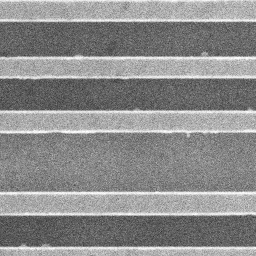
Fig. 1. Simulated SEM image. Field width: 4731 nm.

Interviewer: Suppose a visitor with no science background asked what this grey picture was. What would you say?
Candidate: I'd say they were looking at lines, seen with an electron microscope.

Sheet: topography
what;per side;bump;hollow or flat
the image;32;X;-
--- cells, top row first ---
XXXXXXXXXXXXXXXXXXXXXXXXXXXXXXXX
XXXXXXXXXXXXXXXXXXXXXXXXXXXXXXXX
XXXXXXXXXXXXXXXXXXXXXXXXXXXXXXXX
--------------------------------
--------------------------------
--------------------------------
--------------------------------
XXXXXXXXXXXXXXXXXXXXXXXXXXXXXXXX
XXXXXXXXXXXXXXXXXXXXXXXXXXXXXXXX
XXXXXXXXXXXXXXXXXXXXXXXXXXXXXXXX
--------------------------------
--------------------------------
--------------------------------
--------------------------------
XXXXXXXXXXXXXXXXXXXXXXXXXXXXXXXX
XXXXXXXXXXXXXXXXXXXXXXXXXXXXXXXX
XXXXXX-XXXXX--------XX-X--XX----
--------------------------------
--------------------------------
--------------------------------
--------------------------------
--------------------------------
--------------------------------
--------------------------------
XXXXXXXXXXXXXXXXXXXXXXXXXXXXXXXX
XXXXXXXXXXXXXXXXXXXXXXXXXXXXXXXX
XXXXXXXXXXXXXXXXXXXXXXXXXXXXXXXX
--------------------------------
--------------------------------
--------------------------------
--------------------------------
XXXXXXXXXXXXXXXXXXXXXXXXXXXXXXXX